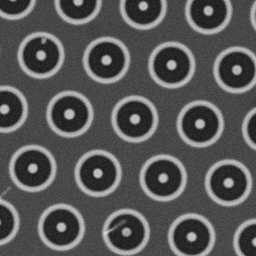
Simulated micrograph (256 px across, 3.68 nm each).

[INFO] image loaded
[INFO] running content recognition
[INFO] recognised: an array of small figures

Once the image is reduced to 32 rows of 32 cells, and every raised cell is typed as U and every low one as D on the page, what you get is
DDDDUUUDDDDDUUUDDDDDUUUUDDDDUUUU
DDDUUUUUDDDDUUUDDDDDUUUUDDDDDUUU
UUUUUUUUUDDUUUUUDDDDUUUUDDDDUUUU
UUUUUUUUUUUUUUUUUUUUUUUUUDDUUUUU
UUUUDDUUUUUUUUUUUUUUUUUUUUUUUUUU
UUUDDDDUUUUUDDDUUUUUUUUUUUUUUUUU
UUUDDDDDUUUDDDDDUUUUDDDUUUUUUDDU
UUUDDDDDUUUDDDDDUUUDDDDDUUUDDDDD
UUUDDDDUUUUDDDDDUUUDDDDDUUUDDDDD
UUUUUUUUUUUUDDDUUUUDDDDDUUUDDDDD
UUUUUUUUUUUUUUUUUUUUUDUUUUUUDDDU
DDUUUUUUUUUUUUUUUUUUUUUUUUUUUUUU
DDDUUUUDDDUUUUUUDDUUUUUUUUUUUUUU
DDDUUUDDDDDUUUUDDDDUUUUUDDDUUUUU
DDDUUUDDDDDUUUDDDDDUUUUDDDDUUUUD
DDUUUUUDDDDUUUDDDDDUUUUDDDDDUUUD
UUUUUUUUDDUUUUUDDDDUUUUDDDDUUUUD
UUUUUUUUUUUUUUUUUUUUUUUDDDDUUUUD
UUUUUUUUUUUUUUUUUUUUUUUUUUUUUUUU
UUDDDDUUUUUDDDUUUUUUUUUUUUUUUUUU
UUDDDDDUUUDDDDUUUUUDDDUUUUUUDUUU
UUDDDDDUUUDDDDDUUUDDDDDUUUDDDDDU
UUDDDDUUUUDDDDDUUUDDDDDUUUDDDDDU
UUUDDUUUUUUDDDUUUUDDDDDUUUDDDDDU
UUUUUUUUUUUUUUUUUUUDDDUUUUUDDDUU
DUUUUUUUUUUUUUUUUUUUUUUUUUUUUUUU
DDUUUUDDDUUUUUUUUUUUUUUUUUUUUUUU
DDUUUDDDDDUUUUDDDDUUUUUDDUUUUUUU
DDUUUDDDDDUUUDDDDDUUUUDDDDUUUUDD
DUUUUDDDDDUUUDDDDDUUUDDDDDUUUUDD
UUUUUUDDDUUUUUDDDDUUUUDDDDUUUUDD
UUUUUUUUUUUUUUUDUUUUUUDDDDUUUUDD